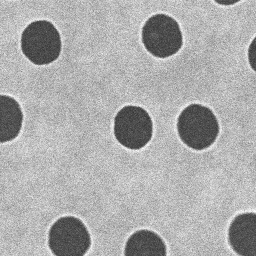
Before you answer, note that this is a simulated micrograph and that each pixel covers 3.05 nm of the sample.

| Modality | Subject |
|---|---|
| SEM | holes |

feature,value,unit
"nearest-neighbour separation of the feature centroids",244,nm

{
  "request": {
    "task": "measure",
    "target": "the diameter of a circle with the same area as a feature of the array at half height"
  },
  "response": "129 nanometres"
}